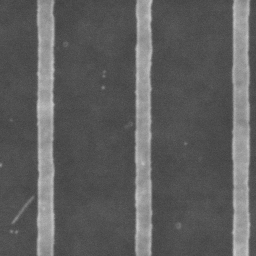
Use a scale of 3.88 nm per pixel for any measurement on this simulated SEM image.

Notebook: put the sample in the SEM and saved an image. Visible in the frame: lines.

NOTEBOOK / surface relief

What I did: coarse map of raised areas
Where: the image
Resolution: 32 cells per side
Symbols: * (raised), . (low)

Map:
.....**..........**..........**.
.....**..........**..........**.
.....**..........**..........**.
.....**..........**..........**.
.....**..........**..........**.
.....**..........**..........**.
.....**..........**..........**.
.....**..........**..........**.
.....**..........**..........**.
.....**..........**..........**.
.....**..........**..........**.
.....**..........**..........**.
.....**..........**..........**.
.....**..........**..........**.
.....**..........**..........**.
.....**..........**..........**.
.....**..........**..........**.
.....**..........**..........**.
.....*...........**..........**.
.....**..........**..........**.
.....**..........**..........**.
.....**..........**..........**.
.....**..........**..........**.
.....**..........**..........**.
.....**..........**..........**.
.....**..........**..........**.
.....**..........**..........**.
.....**..........**..........**.
.....**..........**..........**.
.....**..........**..........**.
.....**..........**..........**.
.....**..........**..........**.